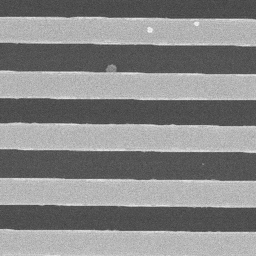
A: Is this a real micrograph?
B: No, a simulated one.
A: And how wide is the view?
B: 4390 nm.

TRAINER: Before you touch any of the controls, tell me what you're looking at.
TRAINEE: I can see lines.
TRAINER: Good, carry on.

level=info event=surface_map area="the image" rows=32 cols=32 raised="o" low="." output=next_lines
................................
................................
oooooooooooooooooooooooooooooooo
oooooooooooooooooooooooooooooooo
oooooooooooooooooooooooooooooooo
...................ooooooooooooo
................................
................................
................................
oooooooooooooooooooooooooooooooo
oooooooooooooooooooooooooooooooo
oooooooooooooooooooooooooooooooo
................................
................................
................................
.oo.o...........................
oooooooooooooooooooooooooooooooo
oooooooooooooooooooooooooooooooo
oooooooooooooooooooooooooooooooo
................................
................................
................................
ooooooooooooooooo...............
oooooooooooooooooooooooooooooooo
oooooooooooooooooooooooooooooooo
oooooooooooooooooooooooooooooooo
................................
................................
................................
oooooooooooooooooooooooooooooooo
oooooooooooooooooooooooooooooooo
oooooooooooooooooooooooooooooooo